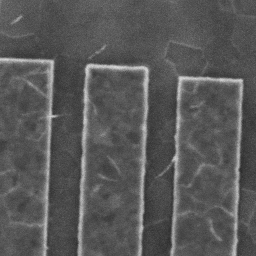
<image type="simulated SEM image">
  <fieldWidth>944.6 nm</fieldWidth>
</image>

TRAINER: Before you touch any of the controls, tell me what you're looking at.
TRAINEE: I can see one or a few lines or trenches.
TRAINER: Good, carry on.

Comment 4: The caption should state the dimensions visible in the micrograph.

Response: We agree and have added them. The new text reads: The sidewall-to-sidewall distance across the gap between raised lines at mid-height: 122 nm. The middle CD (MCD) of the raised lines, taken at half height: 228 nm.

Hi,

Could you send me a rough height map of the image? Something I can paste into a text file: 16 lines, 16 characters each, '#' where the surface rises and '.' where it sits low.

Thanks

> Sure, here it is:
................
................
................
................
###..####.......
###..####..####.
###..####..####.
###..####..####.
###..####..####.
###..####..####.
###..####..####.
###..####..####.
###..####..####.
###..####..####.
###..####..####.
###..####..####.